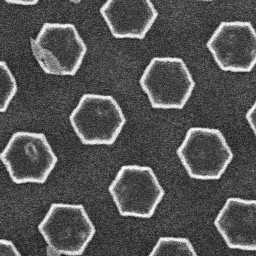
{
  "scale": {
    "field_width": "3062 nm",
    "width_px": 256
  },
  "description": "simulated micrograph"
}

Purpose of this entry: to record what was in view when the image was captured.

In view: raised bodies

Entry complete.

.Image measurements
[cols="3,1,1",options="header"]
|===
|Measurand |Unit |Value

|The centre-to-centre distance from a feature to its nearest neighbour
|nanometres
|944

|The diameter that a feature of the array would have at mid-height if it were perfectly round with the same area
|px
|48.6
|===